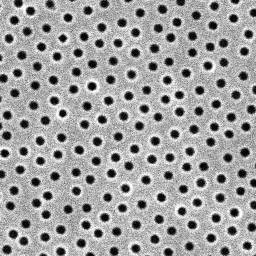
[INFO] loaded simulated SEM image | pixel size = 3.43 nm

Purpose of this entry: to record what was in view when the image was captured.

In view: a regular array of holes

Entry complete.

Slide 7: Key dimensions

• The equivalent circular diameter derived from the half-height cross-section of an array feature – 32.1 nm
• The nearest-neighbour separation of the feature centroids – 62.1 nm